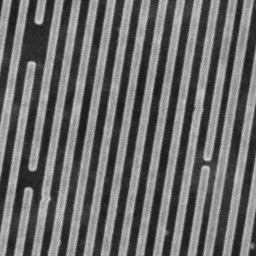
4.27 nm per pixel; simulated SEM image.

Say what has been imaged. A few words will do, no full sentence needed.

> parallel lines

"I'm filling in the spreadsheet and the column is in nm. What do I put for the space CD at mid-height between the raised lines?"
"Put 42.7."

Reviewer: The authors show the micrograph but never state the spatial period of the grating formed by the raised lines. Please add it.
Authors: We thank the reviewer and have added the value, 17.1 pixels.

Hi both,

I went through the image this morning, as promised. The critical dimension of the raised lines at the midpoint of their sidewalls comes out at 31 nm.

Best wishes